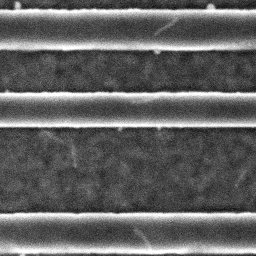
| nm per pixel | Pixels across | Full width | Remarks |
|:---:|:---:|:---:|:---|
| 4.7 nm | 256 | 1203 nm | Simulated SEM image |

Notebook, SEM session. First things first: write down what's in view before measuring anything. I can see lines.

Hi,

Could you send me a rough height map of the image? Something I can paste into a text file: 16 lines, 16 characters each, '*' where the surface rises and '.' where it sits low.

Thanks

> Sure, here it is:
................
****************
****************
................
................
................
****************
****************
................
................
................
................
................
****************
****************
****************